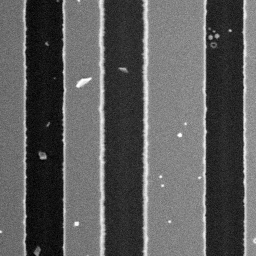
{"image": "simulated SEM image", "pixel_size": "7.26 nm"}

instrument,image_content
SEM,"lines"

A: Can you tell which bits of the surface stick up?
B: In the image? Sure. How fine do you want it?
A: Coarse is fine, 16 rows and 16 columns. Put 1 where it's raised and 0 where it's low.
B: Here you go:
1100110001111001
1100110001111001
1100110001111001
1100110001111001
1100110001111001
1100110001111001
1100110001111001
1100110001111001
1100110001111001
1100110001111001
1100110001111001
1100110001111001
1100110001111001
1100110001111001
1100110001111001
1100110001111001